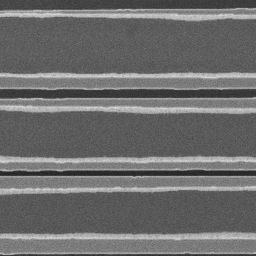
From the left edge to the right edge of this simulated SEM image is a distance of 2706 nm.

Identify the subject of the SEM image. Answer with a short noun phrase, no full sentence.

lines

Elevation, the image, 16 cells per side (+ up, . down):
++++++++++++++++
................
................
................
................
++++++++++++++++
++++++++++++++++
................
................
................
++++++++++++++++
++++++++++++++++
................
................
................
++++++++++++++++